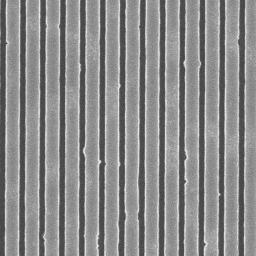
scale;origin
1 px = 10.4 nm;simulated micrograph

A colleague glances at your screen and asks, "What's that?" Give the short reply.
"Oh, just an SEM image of parallel lines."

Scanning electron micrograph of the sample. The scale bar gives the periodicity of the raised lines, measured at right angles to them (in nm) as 207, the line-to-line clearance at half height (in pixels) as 6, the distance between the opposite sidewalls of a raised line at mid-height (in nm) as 144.